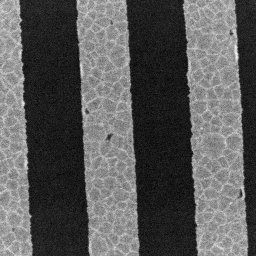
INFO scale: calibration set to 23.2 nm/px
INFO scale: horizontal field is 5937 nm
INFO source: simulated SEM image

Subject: one or a few lines or trenches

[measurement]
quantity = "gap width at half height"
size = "1360 nanometres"